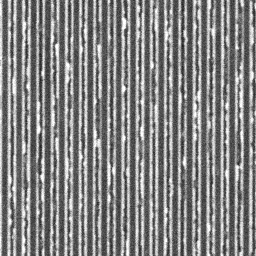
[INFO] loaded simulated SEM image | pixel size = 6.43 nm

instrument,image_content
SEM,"parallel lines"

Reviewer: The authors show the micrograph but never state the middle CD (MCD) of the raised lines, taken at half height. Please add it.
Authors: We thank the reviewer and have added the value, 51.4 nanometers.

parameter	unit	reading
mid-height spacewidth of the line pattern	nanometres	45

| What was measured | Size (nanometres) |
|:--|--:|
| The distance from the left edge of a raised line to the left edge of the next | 91.4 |